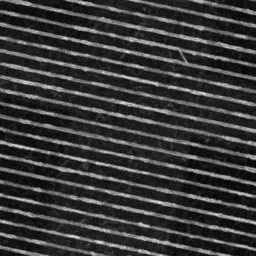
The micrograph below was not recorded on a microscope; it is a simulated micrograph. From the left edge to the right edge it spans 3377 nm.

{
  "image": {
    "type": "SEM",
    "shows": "parallel lines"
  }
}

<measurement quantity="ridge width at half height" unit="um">0.0323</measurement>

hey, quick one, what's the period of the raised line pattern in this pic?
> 169 nanometers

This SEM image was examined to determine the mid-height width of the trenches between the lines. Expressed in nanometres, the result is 134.